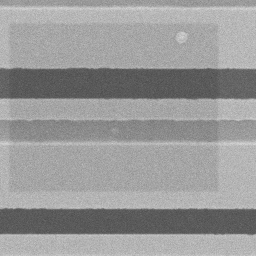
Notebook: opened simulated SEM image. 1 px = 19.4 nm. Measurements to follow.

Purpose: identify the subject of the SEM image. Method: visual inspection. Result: lines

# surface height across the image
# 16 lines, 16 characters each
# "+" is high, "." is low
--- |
++++++++++++++++
++++++++++++++++
++++++++++++++++
++++++++++++++++
................
................
++++++++++++++++
++++++++++++++++
++++++++++++++++
++++++++++++++++
++++++++++++++++
++++++++++++++++
++++++++++++++++
................
................
++++++++++++++++